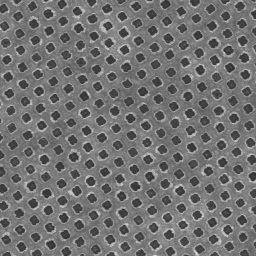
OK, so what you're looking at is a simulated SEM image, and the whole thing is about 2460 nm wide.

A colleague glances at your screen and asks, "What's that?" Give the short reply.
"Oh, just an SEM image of a regular array of holes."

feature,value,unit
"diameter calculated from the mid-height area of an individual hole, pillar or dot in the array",0.0914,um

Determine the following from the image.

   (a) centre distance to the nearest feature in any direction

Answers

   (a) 16.7 pixels